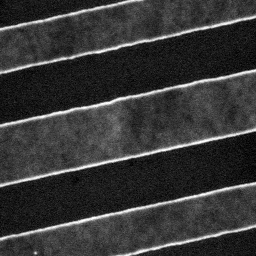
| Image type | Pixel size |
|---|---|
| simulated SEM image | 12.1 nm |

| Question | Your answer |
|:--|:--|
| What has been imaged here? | lines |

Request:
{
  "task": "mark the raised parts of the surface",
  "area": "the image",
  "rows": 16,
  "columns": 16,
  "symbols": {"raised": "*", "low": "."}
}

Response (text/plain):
......**********
.*************..
**********......
*****...........
...............*
...........*****
......**********
.***************
***************.
**********......
*****...........
*...............
...........*****
......**********
..*************.
**********......